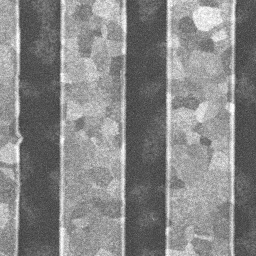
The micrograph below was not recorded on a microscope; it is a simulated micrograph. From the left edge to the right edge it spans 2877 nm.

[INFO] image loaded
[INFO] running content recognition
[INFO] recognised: one or a few lines or trenches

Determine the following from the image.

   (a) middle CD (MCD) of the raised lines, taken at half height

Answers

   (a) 0.711 micrometres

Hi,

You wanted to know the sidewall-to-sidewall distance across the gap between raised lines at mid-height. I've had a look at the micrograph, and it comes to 514 nm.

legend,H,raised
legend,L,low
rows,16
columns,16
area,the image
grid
HLLLHHHHLLLHHHHL
HLLLHHHHLLLHHHHL
HLLLHHHHLLLHHHHL
HLLLHHHHLLLHHHHL
HLLLHHHHLLLHHHHL
HLLLHHHHLLLHHHHL
HLLLHHHHLLLHHHHL
HLLLHHHHLLLHHHHL
HLLLHHHHLLLHHHHL
HLLLHHHHLLLHHHHL
HLLLHHHHLLLHHHHL
HLLLHHHHLLLHHHHL
HLLLHHHHLLLHHHHL
HLLLHHHHLLLHHHHL
HLLLHHHHLLHHHHHL
HLLLHHHHLLHHHHLL